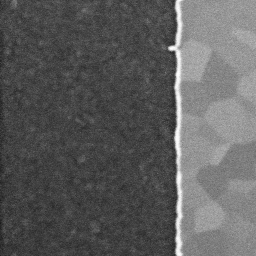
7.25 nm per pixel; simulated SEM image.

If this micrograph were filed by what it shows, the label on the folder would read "one or a few lines or trenches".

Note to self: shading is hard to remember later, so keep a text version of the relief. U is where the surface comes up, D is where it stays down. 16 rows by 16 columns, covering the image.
DDDDDDDDDDDUUUUU
DDDDDDDDDDDUUUUU
DDDDDDDDDDDUUUUU
DDDDDDDDDDDUUUUU
DDDDDDDDDDDUUUUU
DDDDDDDDDDDUUUUU
DDDDDDDDDDDUUUUU
DDDDDDDDDDDUUUUU
DDDDDDDDDDDUUUUU
DDDDDDDDDDDUUUUU
DDDDDDDDDDDUUUUU
DDDDDDDDDDDUUUUU
DDDDDDDDDDDUUUUU
DDDDDDDDDDDUUUUU
DDDDDDDDDDDUUUUU
DDDDDDDDDDDUUUUU